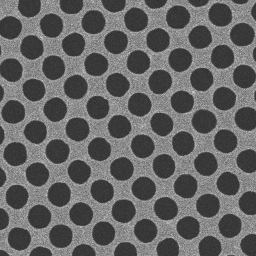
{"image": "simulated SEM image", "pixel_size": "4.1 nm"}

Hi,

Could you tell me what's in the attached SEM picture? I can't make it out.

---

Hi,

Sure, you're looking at a regular array of holes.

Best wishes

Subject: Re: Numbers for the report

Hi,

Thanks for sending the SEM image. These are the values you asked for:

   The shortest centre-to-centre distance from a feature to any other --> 121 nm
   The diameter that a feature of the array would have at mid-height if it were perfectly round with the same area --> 96.6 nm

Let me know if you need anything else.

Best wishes